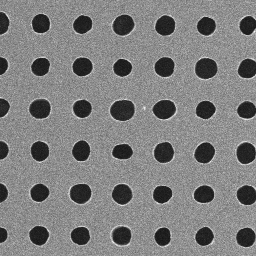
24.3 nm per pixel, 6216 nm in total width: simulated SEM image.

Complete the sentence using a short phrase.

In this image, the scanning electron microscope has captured a regular array of holes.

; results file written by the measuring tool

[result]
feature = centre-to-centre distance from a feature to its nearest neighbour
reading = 1000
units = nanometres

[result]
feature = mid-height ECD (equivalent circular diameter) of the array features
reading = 469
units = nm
